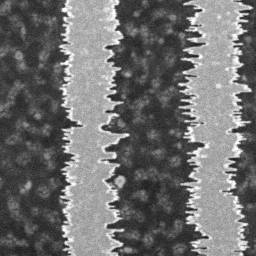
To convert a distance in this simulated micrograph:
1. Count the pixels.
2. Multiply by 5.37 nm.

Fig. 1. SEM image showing one or a few lines or trenches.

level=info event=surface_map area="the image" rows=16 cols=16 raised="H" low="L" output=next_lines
LLLLHHHLLLLLHHHL
LLLLHHHLLLLLHHHL
LLLLHHHLLLLLHHHL
LLLLHHHLLLLLHHHL
LLLLHHHLLLLLHHHL
LLLLHHHLLLLLHHHL
LLLLHHHLLLLLHHHL
LLLLLHHLLLLLHHHL
LLLLHHHLLLLLHHHL
LLLLHHHLLLLLHHHL
LLLLHHHLLLLLHHLL
LLLLHHHLLLLLHHLL
LLLLHHHLLLLLHHHL
LLLLHHHLLLLLHHHL
LLLLHHHLLLLLLHHL
LLLLHHHLLLLLHHHL